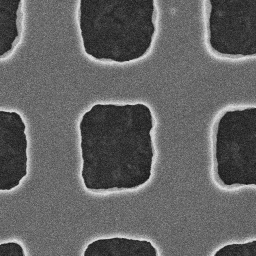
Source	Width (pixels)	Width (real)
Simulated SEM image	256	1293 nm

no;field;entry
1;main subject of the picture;holes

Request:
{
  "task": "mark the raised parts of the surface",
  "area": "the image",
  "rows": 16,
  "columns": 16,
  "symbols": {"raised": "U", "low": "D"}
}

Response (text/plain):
DUUUUDDDDDUUUDDD
DUUUUDDDDDUUUDDD
DUUUUDDDDDUUUDDD
UUUUUUDDDUUUUUDD
UUUUUUUUUUUUUUUU
UUUUUUUUUUUUUUUU
UUUUUUUUUUUUUUUU
DUUUUDDDDUUUUUDD
DDUUUDDDDUUUUDDD
DDUUUDDDDDUUUDDD
DDUUUDDDDUUUUDDD
DUUUUDDDDUUUUUDD
UUUUUUUUUUUUUUUU
UUUUUUUUUUUUUUUU
UUUUUUUUUUUUUUUU
DUUUUUDDDDUUUUDD